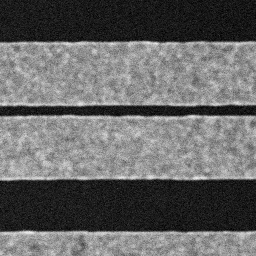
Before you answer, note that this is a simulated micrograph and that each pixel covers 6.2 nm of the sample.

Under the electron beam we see wiring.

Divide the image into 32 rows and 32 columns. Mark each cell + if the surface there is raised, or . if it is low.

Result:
................................
................................
................................
................................
................................
++++++++++++++++++++++++++++++++
++++++++++++++++++++++++++++++++
++++++++++++++++++++++++++++++++
++++++++++++++++++++++++++++++++
++++++++++++++++++++++++++++++++
++++++++++++++++++++++++++++++++
++++++++++++++++++++++++++++++++
++++++++++++++++++++++++++++++++
................................
................................
++++++++++++++++++++++++++++++++
++++++++++++++++++++++++++++++++
++++++++++++++++++++++++++++++++
++++++++++++++++++++++++++++++++
++++++++++++++++++++++++++++++++
++++++++++++++++++++++++++++++++
++++++++++++++++++++++++++++++++
................................
................................
................................
................................
................................
................................
................................
++++++++++++++++++++++++++++++++
++++++++++++++++++++++++++++++++
++++++++++++++++++++++++++++++++